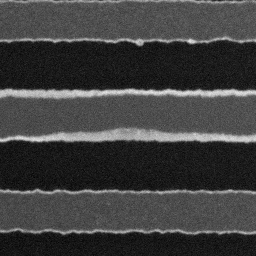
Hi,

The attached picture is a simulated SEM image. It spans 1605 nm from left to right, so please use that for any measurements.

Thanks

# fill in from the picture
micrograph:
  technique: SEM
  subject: lines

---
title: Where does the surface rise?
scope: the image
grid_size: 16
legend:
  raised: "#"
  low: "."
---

################
################
################
................
................
................
################
################
#######..#######
................
................
................
################
################
....##.#...#####
................